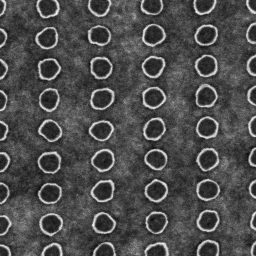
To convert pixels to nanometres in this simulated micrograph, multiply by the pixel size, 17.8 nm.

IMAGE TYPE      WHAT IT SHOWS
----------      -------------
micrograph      a regular array of raised bodies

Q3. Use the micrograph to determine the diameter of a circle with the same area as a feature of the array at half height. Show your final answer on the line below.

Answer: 376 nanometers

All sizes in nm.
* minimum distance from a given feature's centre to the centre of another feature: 549